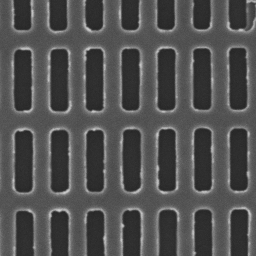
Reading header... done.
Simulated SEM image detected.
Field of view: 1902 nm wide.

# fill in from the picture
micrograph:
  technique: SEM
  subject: a regular array of holes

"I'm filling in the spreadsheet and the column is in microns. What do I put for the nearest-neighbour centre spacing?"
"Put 0.265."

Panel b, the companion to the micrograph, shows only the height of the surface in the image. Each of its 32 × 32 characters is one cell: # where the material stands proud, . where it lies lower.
##..##..###..##..###..##..###..#
##..##..###..##..###..##..###..#
##..##..###..##..###..##..###..#
##..##..###..##..###..###.###.##
################################
################################
##..###.###..##..###..##..###..#
##..##...##..##..###..##..###..#
##..##...##..##..###..##..###..#
##..##...##..##..###..##..###..#
##..##...##..##..###..##..###..#
##..##...##..##...##..##..###..#
##..##...##..##...##..##..###..#
##..##..###..##..###..###.###..#
################################
################################
##..###.###..###.###..##..###..#
##..##...##..##...##..##...##..#
##..##...##..##...##..##..###..#
##..##...##..##...##..##..###..#
##..##...##..##...##..##...##..#
##..##...##..##...##..##...##..#
##..##...##..##...##..##...##..#
##..##..###..###.###..##..###..#
################################
################################
##..###.###..###.###..##..###..#
##..##...##..##...##..##..###..#
##..##...##..##...##..##...##..#
##..##...##..##...##..##...##..#
##..##...##..##...##..##...##..#
##..##...##..##...##..##...##..#